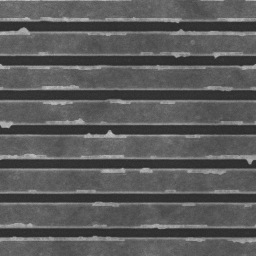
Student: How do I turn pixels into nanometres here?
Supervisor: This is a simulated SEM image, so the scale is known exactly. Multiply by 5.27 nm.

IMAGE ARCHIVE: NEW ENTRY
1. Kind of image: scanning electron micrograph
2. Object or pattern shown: parallel lines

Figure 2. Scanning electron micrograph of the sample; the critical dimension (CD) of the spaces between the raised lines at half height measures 11 pixels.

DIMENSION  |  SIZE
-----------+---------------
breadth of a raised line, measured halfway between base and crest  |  0.125 um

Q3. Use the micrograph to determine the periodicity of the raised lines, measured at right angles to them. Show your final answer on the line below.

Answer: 181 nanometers